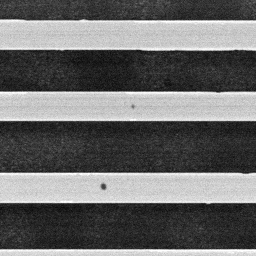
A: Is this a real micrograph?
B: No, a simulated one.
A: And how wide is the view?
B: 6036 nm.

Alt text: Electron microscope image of lines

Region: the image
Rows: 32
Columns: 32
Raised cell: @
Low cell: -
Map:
--------------------------------
--------------------------------
--------------------------------
@@@@@@@@@@@@@@@@@@@@@@@@@@@@@@@@
@@@@@@@@@@@@@@@@@@@@@@@@@@@@@@@@
@@@@@@@@@@@@@@@@@@@@@@@@@@@@@@@@
--------------------------------
--------------------------------
--------------------------------
--------------------------------
--------------------------------
--------------------------------
@@@@@@@@@@@@@@@@@@@@@@@@@@@@@@@@
@@@@@@@@@@@@@@@@@@@@@@@@@@@@@@@@
@@@@@@@@@@@@@@@@@@@@@@@@@@@@@@@@
--------------------------------
--------------------------------
--------------------------------
--------------------------------
--------------------------------
--------------------------------
--------------------------------
@@@@@@@@@@@@@@@@@@@@@@@@@@@@@@@@
@@@@@@@@@@@@@@@@@@@@@@@@@@@@@@@@
@@@@@@@@@@@@@@@@@@@@@@@@@@@@@@@@
--------------------------------
--------------------------------
--------------------------------
--------------------------------
--------------------------------
--------------------------------
@@@@@@@@@@@@@@@@@@@@@@@@@@@@@@@@